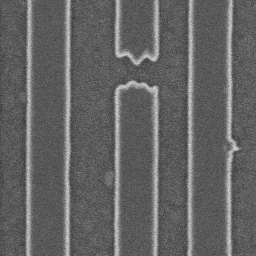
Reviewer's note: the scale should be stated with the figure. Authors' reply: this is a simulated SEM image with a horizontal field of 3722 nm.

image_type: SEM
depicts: one or a few lines or trenches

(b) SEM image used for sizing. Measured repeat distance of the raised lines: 1180 nm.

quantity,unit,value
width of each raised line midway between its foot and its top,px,39.4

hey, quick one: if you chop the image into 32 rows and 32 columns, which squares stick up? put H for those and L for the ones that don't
LLLLHHHHLLLLLLLHHHHHLLLLHHHHHLLL
LLLLHHHHLLLLLLLHHHHHLLLLHHHHHLLL
LLLLHHHHLLLLLLLHHHHHLLLLHHHHHLLL
LLLLHHHHLLLLLLLHHHHHLLLLHHHHHLLL
LLLLHHHHLLLLLLLHHHHHLLLLHHHHHLLL
LLLLHHHHLLLLLLLHHHHHLLLLHHHHHLLL
LLLLHHHHLLLLLLLHHHHHLLLLHHHHHLLL
LLLLHHHHLLLLLLLLLHLLLLLLHHHHHLLL
LLLLHHHHLLLLLLLLLLLLLLLLHHHHHLLL
LLLLHHHHLLLLLLLLLLLLLLLLHHHHHLLL
LLLLHHHHLLLLLLLLHLLLLLLLHHHHHLLL
LLLLHHHHHLLLLLLHHHHLLLLLHHHHHLLL
LLLLHHHHLLLLLLLHHHHLLLLLHHHHHLLL
LLLLHHHHLLLLLLLHHHHLLLLLHHHHHLLL
LLLLHHHHLLLLLLLHHHHLLLLLHHHHHLLL
LLLLHHHHLLLLLLLHHHHLLLLLHHHHHLLL
LLLLHHHHLLLLLLLHHHHLLLLLHHHHHLLL
LLLLHHHHHLLLLLLHHHHLLLLLHHHHHLLL
LLLLHHHHHLLLLLLHHHHLLLLLHHHHHLLL
LLLLHHHHHLLLLLLHHHHLLLLLHHHHHLLL
LLLLHHHHLLLLLLLHHHHLLLLLHHHHHLLL
LLLLHHHHLLLLLLLHHHHLLLLLHHHHHLLL
LLLLHHHHLLLLLLLHHHHLLLLLHHHHHLLL
LLLLHHHHLLLLLLLHHHHLLLLLHHHHHLLL
LLLLHHHHLLLLLLLHHHHLLLLLHHHHHLLL
LLLLHHHHLLLLLLLHHHHLLLLLHHHHHLLL
LLLLHHHHLLLLLLLHHHHLLLLLHHHHHLLL
LLLLHHHHLLLLLLLHHHHLLLLLHHHHHLLL
LLLLHHHHLLLLLLLHHHHLLLLLHHHHHLLL
LLLLHHHHLLLLLLLHHHHLLLLLHHHHHLLL
LLLLHHHHLLLLLLLHHHHLLLLLHHHHHLLL
LLLLHHHHLLLLLLLHHHHLLLLLHHHHHLLL